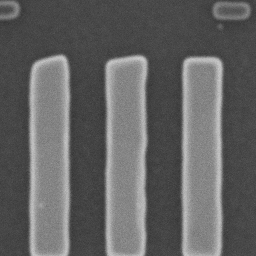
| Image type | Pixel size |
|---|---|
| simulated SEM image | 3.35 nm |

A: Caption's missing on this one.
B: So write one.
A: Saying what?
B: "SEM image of wiring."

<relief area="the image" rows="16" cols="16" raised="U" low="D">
UDDDDDDDDDDDDUUD
DDDDDDDDDDDDDDDD
DDDDDDDDDDDDDDDD
DDDDDDDDDDDDDDDD
DDUUDDDUUDDUUUDD
DDUUDDDUUDDDUUDD
DDUUDDDUUDDDUUDD
DDUUDDDUUDDDUUDD
DDUUDDDUUDDUUUDD
DDUUDDDUUDDUUUDD
DDUUDDDUUDDUUUDD
DDUUDDDUUDDUUUDD
DDUUDDDUUDDUUUDD
DDUUDDDUUDDUUUDD
DDUUDDDUUDDUUUDD
DDUUDDDUUDDUUUDD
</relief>